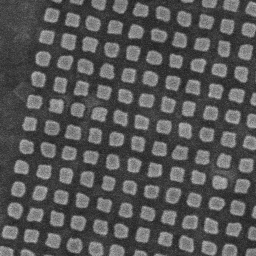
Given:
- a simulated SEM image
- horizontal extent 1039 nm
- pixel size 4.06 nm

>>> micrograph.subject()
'a regular array of raised bodies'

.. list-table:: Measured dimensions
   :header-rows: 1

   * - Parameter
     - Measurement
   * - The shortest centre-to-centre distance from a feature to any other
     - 0.0867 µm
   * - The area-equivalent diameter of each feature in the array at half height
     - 59.2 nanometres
